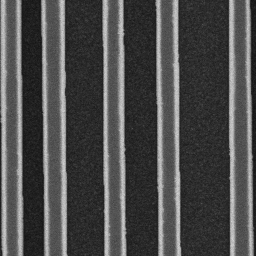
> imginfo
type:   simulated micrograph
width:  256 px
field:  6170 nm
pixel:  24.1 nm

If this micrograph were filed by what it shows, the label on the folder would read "lines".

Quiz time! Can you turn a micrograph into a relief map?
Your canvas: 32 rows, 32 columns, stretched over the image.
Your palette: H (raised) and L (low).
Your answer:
HHLLLHHHLLLLLHHLLLLLHHLLLLLLLHHL
HHHLLHHHLLLLLHHLLLLLHHLLLLLLLHHL
HHHLLHHHLLLLLHHLLLLLHHLLLLLLLHHL
HHHLLHHHLLLLLHHLLLLLHHLLLLLLLHHL
HHHLLHHHLLLLLHHLLLLLHHLLLLLLLHHL
HHHLLHHHLLLLLHHLLLLLHHLLLLLLLHHL
HHHLLHHHLLLLLHHLLLLLHHLLLLLLLHHL
HHHLLHHHLLLLLHHLLLLLHHLLLLLLLHHL
HHHLLHHHLLLLLHHLLLLLHHLLLLLLLHHL
HHHLLHHHLLLLLHHLLLLLHHLLLLLLLHHL
HHHLLHHHLLLLLHHLLLLLHHLLLLLLLHHL
HHHLLHHHLLLLLHHLLLLLHHLLLLLLLHHL
HHHLLHHHLLLLLHHLLLLLHHLLLLLLLHHL
HHHLLHHHLLLLLHHLLLLLHHLLLLLLLHHL
HHHLLHHHLLLLLHHLLLLLHHLLLLLLLHHL
HHHLLHHHLLLLLHHLLLLLHHLLLLLLLHHL
HHHLLHHHLLLLLHHLLLLLHHLLLLLLLHHL
HHHLLHHHLLLLLHHLLLLLHHLLLLLLLHHL
HHHLLHHHLLLLLHHLLLLLHHLLLLLLLHHL
HHHLLHHHLLLLLHHLLLLLHHLLLLLLLHHL
HHHLLHHHLLLLLHHLLLLLHHLLLLLLLHHL
HHHLLLHHLLLLLHHLLLLLHHLLLLLLLHHL
HHHLLLHHLLLLLHHHLLLLHHLLLLLLLHHL
HHHLLLHHLLLLLHHHLLLLHHLLLLLLLHHH
HHHLLLHHLLLLLHHHLLLLHHLLLLLLLHHH
HHHLLLHHLLLLLHHHLLLLHHLLLLLLLHHH
HHHLLLHHLLLLLHHHLLLLHHLLLLLLLHHH
HHHLLLHHLLLLLHHHLLLLHHLLLLLLLHHH
HHHLLLHHLLLLLHHHLLLLHHLLLLLLLHHH
HHHLLLHHLLLLLHHHLLLLHHLLLLLLLHHH
HHHLLLHHLLLLLHHHLLLLHHLLLLLLLHHH
HHHLLLHHLLLLLHHHLLLLHHLLLLLLLHHH